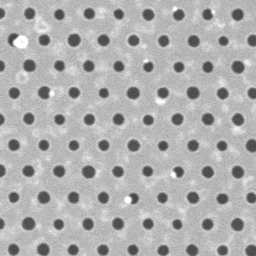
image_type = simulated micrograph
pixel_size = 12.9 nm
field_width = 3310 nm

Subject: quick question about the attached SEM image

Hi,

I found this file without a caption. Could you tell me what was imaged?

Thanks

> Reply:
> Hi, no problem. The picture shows a regular array of holes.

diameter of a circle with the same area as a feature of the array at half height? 162 nm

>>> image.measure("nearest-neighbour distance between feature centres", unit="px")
29.4